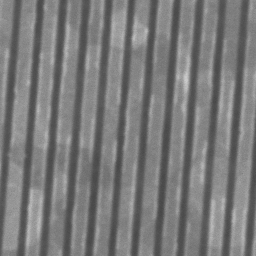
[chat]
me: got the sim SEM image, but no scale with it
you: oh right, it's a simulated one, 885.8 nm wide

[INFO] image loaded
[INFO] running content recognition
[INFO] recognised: parallel lines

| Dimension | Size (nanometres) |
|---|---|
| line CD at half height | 50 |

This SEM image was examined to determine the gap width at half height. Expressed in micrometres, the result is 0.0293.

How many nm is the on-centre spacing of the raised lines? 78.5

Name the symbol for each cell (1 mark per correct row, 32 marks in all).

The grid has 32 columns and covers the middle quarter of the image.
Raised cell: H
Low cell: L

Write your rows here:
HHHLLHHHHLLHHHLLLHHHLLLHHHLLHHHL
HHHLLHHHHLLHHHLLLHHHLLHHHHLLHHHL
HHHLLHHHHLLHHHLLLHHHLLHHHHLLHHHL
HHHLLHHHHLLHHHLLLHHHLLHHHLLLHHHL
HHHLLHHHHLLHHHLLHHHHLLHHHLLLHHHL
HHHLLHHHLLLHHHLLHHHHLLHHHLLLHHHL
HHHLLHHHLLLHHHLLHHHHLLHHHLLLHHHL
HHHLLHHHLLLHHHLLHHHHLLHHHLLHHHHL
HHLLLHHHLLLHHHLLHHHHLLHHHLLHHHHL
HHLLLHHHLLHHHHLLHHHLLLHHHLLHHHHL
HHLLLHHHLLHHHHLLHHHLLLHHHLLHHHHL
HHLLLHHHLLHHHHLLHHHLLHHHHLLHHHHL
HHLLHHHHLLHHHLLLHHHLLHHHHLLHHHHL
HHLLHHHHLLHHHHLLHHHLLHHHHLLHHHLL
HHLLHHHHLLHHHLLLHHHLLHHHHLLHHHLL
HHLLHHHHLLHHHLLHHHHLLHHHHLLHHHLL
HHLLHHHHLLHHHLLHHHHLLHHHLLLHHHLL
HHLLHHHHLLHHHLLHHHHLLHHHLLLHHHLL
HHLLHHHLLLHHHLLHHHHLLHHHLLLHHHLL
HHLLHHHLLLHHHLLHHHHLLHHHLLLHHHLL
HHLLHHHLLLHHHLLHHHHLLHHHLLHHHHLL
HLLLHHHLLLHHHLLHHHHLLHHHLLHHHHLL
HLLLHHHLLHHHHLLHHHLLLHHHLLHHHHLL
HLLLHHHLLHHHHLLHHHLLLHHHLLHHHHLL
HLLLHHHLLHHHHLLHHHLLLHHHLLHHHHLL
HLLHHHHLLHHHLLLHHHLLLHHHLLHHHHLL
HLLHHHHLLHHHLLLHHHLLHHHHLLHHHLLL
HLLHHHHLLHHHHLHHHHLLHHHHLLHHHLLL
HLLHHHHLLHHHLLHHHHLLHHHHLLHHHLLL
HLLHHHHLLHHHLLHHHHLLHHHHLLHHHLLL
HLLHHHHLLHHHLLHHHHLLHHHHLLHHHLLL
HLLHHHLLLHHHLLHHHHLLHHHLLLHHHLLL